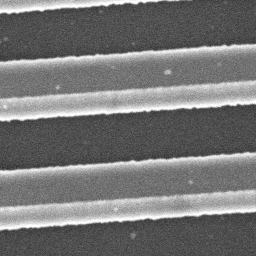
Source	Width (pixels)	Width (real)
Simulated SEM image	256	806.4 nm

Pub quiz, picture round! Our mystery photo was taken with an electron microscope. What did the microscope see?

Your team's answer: lines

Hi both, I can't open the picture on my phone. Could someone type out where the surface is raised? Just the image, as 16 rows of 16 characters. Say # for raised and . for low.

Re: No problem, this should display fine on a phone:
####............
................
................
......##########
################
################
###############.
#...............
................
................
...#############
################
################
############....
................
................